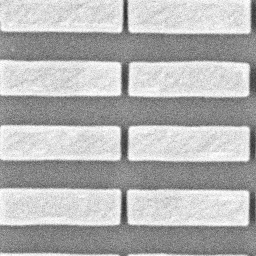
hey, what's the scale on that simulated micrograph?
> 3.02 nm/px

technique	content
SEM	wiring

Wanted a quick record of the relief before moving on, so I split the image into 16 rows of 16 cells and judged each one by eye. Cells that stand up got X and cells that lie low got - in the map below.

XXXXXXXXXXXXXXXX
XXXXXXXXXXXXXXXX
----------------
----------------
XXXXXXXXXXXXXXXX
XXXXXXXXXXXXXXXX
----------------
----------------
XXXXXXX-XXXXXXXX
XXXXXXXXXXXXXXXX
----------------
----------------
XXXXXXXXXXXXXXXX
XXXXXXXXXXXXXXXX
----------------
----------------